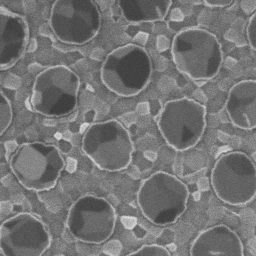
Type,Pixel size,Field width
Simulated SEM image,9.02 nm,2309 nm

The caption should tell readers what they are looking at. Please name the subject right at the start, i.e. a regular array of raised bodies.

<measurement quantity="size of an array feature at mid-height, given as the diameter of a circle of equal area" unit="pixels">50.5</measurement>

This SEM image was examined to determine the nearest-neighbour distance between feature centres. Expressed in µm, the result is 0.666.